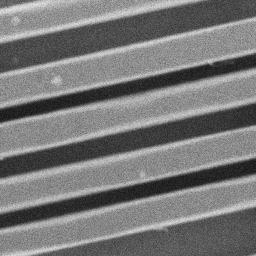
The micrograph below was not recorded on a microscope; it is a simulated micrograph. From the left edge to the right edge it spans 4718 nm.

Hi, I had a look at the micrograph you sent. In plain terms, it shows lines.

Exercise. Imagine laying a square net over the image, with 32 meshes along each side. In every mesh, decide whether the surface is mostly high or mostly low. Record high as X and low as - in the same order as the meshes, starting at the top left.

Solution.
----XXXXXXXXXXXXXXXXXXX---------
XXXXXXXXXXXXXXXXXX--------------
XXXXXXXXXXXXX------------------X
XXXXXXXXX-----------------XXXXXX
XXXX-----------------XXXXXXXXXXX
-----------------XXXXXXXXXXXXXXX
-------------XXXXXXXXXXXXXXXXXXX
--------XXXXXXXXXXXXXXXXXXXX----
---XXXXXXXXXXXXXXXXXXXXX--------
XXXXXXXXXXXXXXXXXXX--------XXXXX
XXXXXXXXXXXXXX---------XXXXXXXXX
XXXXXXXXXX--------XXXXXXXXXXXXXX
XXXXX---------XXXXXXXXXXXXXXXXXX
X--------XXXXXXXXXXXXXXXXXXXX---
----XXXXXXXXXXXXXXXXXXXX--------
XXXXXXXXXXXXXXXXXXX-------------
XXXXXXXXXXXXXXX-------------XXXX
XXXXXXXXXXX------------XXXXXXXXX
XXXXXX-------------XXXXXXXXXXXXX
X-------------XXXXXXXXXXXXXXXXXX
---------XXXXXXXXXXXXXXXXXXX----
----XXXXXXXXXXXXXXXXXXXX--------
XXXXXXXXXXXXXXXXXXXX---------XXX
XXXXXXXXXXXXXXX---------XXXXXXXX
XXXXXXXXXX---------XXXXXXXXXXXXX
XXXXX----------XXXXXXXXXXXXXXXXX
X---------XXXXXXXXXXXXXXXXXX----
------XXXXXXXXXXXXXXXXXX--------
-XXXXXXXXXXXXXXXXXXX------------
XXXXXXXXXXXXXXX-----------------
XXXXXXXXXX----------------------
XXXXX---------------------------